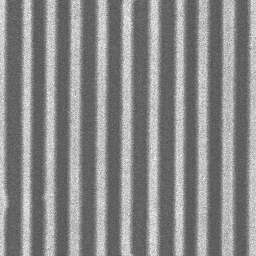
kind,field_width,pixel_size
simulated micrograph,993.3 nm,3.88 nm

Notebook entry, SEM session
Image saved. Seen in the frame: parallel lines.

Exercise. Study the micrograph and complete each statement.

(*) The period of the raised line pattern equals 97.6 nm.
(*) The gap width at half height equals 57.3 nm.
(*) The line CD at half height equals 36.9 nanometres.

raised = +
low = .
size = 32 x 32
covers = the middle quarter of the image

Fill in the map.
..++....+++....++....+++....++..
..++....+++....++....+++....++..
..++....++.....++....+++....++..
..++....++.....++....+++....++..
..++....++.....++....+++....++..
..++....++.....++....+++....++..
..++....++.....++....+++....++..
..++....++.....++....+++....++..
..++....++.....++....+++....++..
..++....++.....++....+++....++..
..++....++.....++....+++....++..
..++....++.....++....+++....++..
..++....++.....++....+++....++..
..++....++.....++....+++....++..
..++....++.....++....+++....++..
..++....++.....++....+++....++..
..++....++.....++....+++....++..
..++....++.....++....+++....++..
..++....++.....++....+++....++..
..++....++.....++....+++....++..
..++....++....+++....+++....++..
..++....++....+++....+++....++..
..++....++....+++....+++....++..
..++....++....+++....+++....++..
..++....++....+++....++.....++..
..++....++....+++....++.....++..
..++....++....+++....++.....++..
..++....++....+++....++.....++..
..++....+++...+++....++.....++..
..++....+++...+++....++.....++..
..++....+++...+++....++.....++..
..++....+++...+++....++.....++..